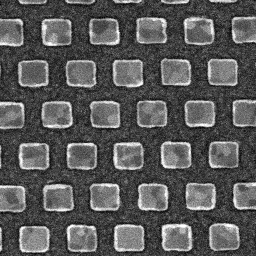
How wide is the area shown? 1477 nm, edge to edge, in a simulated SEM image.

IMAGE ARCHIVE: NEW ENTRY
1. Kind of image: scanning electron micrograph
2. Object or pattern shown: a regular array of raised bodies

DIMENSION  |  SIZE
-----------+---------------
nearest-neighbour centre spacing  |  271 nm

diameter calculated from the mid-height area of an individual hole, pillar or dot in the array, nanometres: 173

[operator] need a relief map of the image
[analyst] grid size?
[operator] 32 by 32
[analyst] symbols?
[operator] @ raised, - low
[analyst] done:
--------------------------------
--------------------------------
@@----------@@---@@@---@@@---@@@
@@@--@@@@--@@@@--@@@@--@@@@--@@@
@@@--@@@@--@@@@--@@@@--@@@@--@@@
@@----@@----------------@@------
--------------------------------
--------------------------@@@---
--@@@@--@@@@--@@@@--@@@@--@@@@--
--@@@@--@@@@--@@@@--@@@@--@@@@--
---@@@---@@@---@@----@@----@@---
--------------------------------
--------------------------------
@@@--@@@@--@@@@--@@@@--@@@@--@@@
@@@--@@@@--@@@@--@@@@--@@@@--@@@
@@@--@@@@---@@@--@@@@--@@@@--@@@
--------------------------------
--------------------------------
--@@@@--@@@@--@@@@--@@@@--@@@@--
--@@@@--@@@@--@@@@--@@@@--@@@@--
---@@@--@@@@--@@@@--@@@@--@@@@--
--------------------------------
--------------------------------
@@@---@@@--@@@@--@@@@--@@@@--@@@
@@@---@@@--@@@@--@@@@--@@@@--@@@
@@@---@@@--@@@@--@@@@--@@@@--@@@
--------------------------------
--------------------------------
---@@@---@@@---@@@--@@@@--@@@@--
--@@@@---@@@--@@@@--@@@@--@@@@--
--@@@@---@@@--@@@@--@@@@--@@@@--
--------------------------------